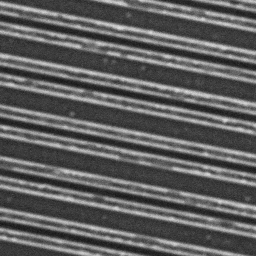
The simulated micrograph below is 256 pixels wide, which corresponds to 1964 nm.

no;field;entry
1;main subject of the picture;parallel lines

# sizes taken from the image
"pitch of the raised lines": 193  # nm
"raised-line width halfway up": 80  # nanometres